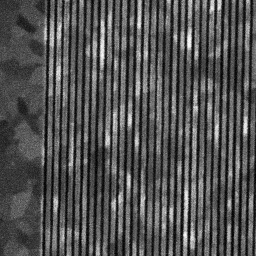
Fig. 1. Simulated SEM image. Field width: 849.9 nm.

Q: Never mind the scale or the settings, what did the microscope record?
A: parallel lines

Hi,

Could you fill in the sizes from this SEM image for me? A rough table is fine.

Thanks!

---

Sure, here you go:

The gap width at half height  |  11.6 nanometers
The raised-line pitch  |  0.0241 microns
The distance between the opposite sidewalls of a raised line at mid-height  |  12 nanometers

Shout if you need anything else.